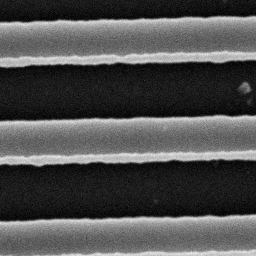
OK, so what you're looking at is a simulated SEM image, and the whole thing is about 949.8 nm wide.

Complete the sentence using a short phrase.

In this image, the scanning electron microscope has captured lines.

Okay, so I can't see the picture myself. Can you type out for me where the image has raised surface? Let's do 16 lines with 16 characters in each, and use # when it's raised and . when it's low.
................
################
################
################
................
................
................
.....###########
################
################
................
................
................
..............##
################
################